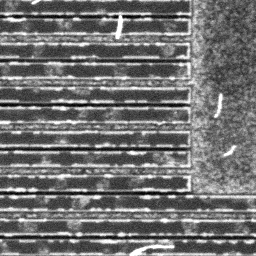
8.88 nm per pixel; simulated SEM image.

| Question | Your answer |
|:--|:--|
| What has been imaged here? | parallel lines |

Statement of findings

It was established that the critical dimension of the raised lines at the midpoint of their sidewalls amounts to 0.14 µm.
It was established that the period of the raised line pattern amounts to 0.196 microns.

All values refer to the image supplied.